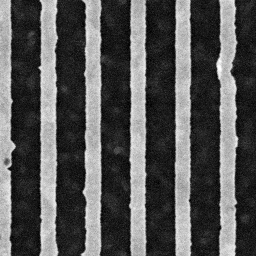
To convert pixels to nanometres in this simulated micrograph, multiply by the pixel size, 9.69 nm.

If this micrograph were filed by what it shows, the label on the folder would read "parallel lines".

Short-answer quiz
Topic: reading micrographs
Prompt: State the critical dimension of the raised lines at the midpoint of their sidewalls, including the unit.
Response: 140 nanometers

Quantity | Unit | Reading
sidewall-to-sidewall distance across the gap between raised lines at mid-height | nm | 294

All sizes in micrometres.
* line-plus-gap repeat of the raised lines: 0.432